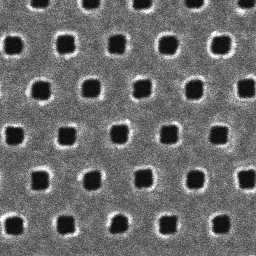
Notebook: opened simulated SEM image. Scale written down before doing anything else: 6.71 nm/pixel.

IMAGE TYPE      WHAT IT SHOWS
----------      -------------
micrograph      a regular array of holes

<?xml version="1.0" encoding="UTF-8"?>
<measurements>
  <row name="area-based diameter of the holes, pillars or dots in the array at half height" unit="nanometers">130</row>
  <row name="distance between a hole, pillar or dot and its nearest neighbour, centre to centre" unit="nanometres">341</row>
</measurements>